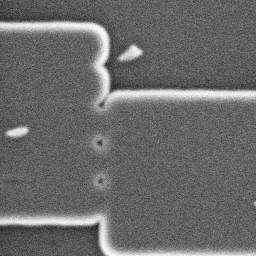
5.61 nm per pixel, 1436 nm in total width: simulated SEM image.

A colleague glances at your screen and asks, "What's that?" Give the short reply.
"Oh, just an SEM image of wiring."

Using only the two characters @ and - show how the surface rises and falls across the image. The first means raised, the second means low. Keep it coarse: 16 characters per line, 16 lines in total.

----------------
----------------
@@@@@@@---------
@@@@@@@---------
@@@@@@@---------
@@@@@@@---------
@@@@@@@@@@@@@@@@
@@@@@@@@@@@@@@@@
@@@@@@@@@@@@@@@@
@@@@@@@@@@@@@@@@
@@@@@@@@@@@@@@@@
@@@@@@@@@@@@@@@@
@@@@@@@@@@@@@@@@
@@@@@@@@@@@@@@@@
------@@@@@@@@@@
------@@@@@@@@@@